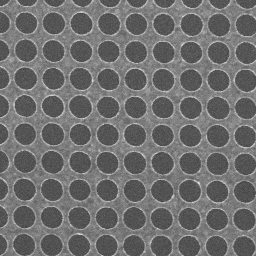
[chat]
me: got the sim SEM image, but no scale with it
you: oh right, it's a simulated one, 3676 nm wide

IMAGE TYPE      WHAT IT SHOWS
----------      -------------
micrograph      a regular array of holes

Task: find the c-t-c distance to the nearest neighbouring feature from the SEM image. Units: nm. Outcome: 392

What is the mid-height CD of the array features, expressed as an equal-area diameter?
321 nm